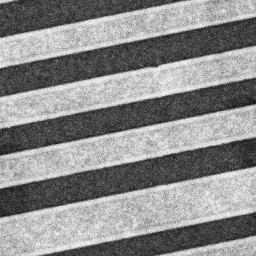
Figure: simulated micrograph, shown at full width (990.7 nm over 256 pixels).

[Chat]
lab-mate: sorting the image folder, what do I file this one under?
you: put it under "one or a few lines or trenches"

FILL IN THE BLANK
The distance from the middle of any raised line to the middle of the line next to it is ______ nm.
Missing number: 237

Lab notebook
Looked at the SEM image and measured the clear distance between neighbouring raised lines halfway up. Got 126 nm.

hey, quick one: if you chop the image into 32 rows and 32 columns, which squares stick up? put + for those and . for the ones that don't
.......................+++++++++
..................++++++++++++++
.............++++++++++++++++...
........++++++++++++++++........
...++++++++++++++++.............
++++++++++++++..................
++++++++......................++
+++......................+++++++
....................++++++++++++
...............++++++++++++++++.
..........++++++++++++++++......
.....++++++++++++++++...........
++++++++++++++++................
+++++++++++....................+
++++++....................++++++
+....................+++++++++++
................++++++++++++++++
...........++++++++++++++++++...
......++++++++++++++++++........
.++++++++++++++++++.............
++++++++++++++..................
+++++++++.....................++
++++.....................+++++++
....................++++++++++++
...............+++++++++++++++++
..........++++++++++++++++++++++
.....++++++++++++++++++++++++++.
++++++++++++++++++++++++++......
+++++++++++++++++++++...........
++++++++++++++++................
+++++++++++.................++++
++++++..................++++++++